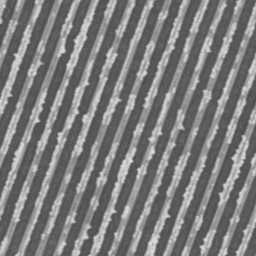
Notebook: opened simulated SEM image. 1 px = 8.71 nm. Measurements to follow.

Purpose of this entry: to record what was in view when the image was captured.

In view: parallel lines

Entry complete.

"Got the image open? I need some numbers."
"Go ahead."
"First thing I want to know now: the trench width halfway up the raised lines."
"10.6 pixels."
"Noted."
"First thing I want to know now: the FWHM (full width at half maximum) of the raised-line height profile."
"59.2 nm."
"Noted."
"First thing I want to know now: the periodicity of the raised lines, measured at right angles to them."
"150 nanometres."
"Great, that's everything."